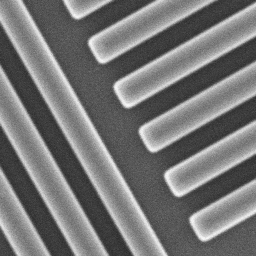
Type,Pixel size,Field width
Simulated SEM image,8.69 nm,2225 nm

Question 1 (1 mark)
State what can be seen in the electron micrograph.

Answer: groups of lines, slits or small figures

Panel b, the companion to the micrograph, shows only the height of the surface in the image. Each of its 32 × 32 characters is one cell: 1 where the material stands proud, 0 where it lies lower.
11100000111110000001111111000000
11100000011000000111111100000011
11110000000000001111110000001111
01110000000000111111100000011111
01111000000011111110000001111111
00111100000111111000000111111100
00111100000011100000011111110000
00011110000011000000111111100000
00011110000000000011111110000001
10001111000000001111111000000111
10000111000000011111100000011111
11000111100000011110000001111111
11000011110000011100000011111110
11100011110000000000001111111000
11100001111000000000111111100000
11110001111000000011111110000001
01111000111100000011111100000011
01111000011100000011110000001111
00111100011110000001000000111111
00111100001111000000000011111110
00011110001111000000000111111000
00001110000111100000011111110000
10001111000111100000011111000000
10000111100011110000011100000011
11000111100001110000000000001111
11000011110001111000000000011111
11100011110000111100000001111111
11110001111000111100000011111100
11110000111000011110000011110000
01111000111100011110000001100000
01111000011110001111000000000000
00111100011110000111000000000000